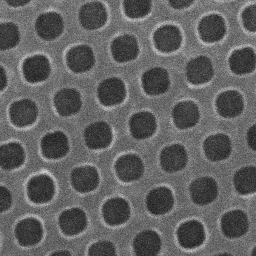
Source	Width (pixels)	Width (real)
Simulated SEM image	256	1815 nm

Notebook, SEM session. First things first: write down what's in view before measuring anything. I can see a regular array of holes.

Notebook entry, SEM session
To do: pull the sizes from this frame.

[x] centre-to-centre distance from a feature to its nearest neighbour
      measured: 316 nanometres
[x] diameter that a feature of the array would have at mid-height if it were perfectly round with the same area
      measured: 0.212 microns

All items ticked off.